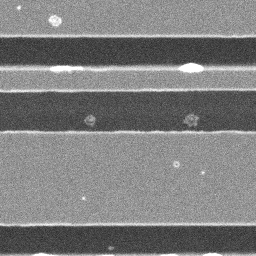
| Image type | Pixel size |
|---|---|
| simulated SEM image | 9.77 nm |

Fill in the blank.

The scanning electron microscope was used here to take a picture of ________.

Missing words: lines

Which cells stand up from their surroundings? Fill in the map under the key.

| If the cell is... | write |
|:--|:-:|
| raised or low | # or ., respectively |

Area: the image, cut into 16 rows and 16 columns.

################
################
................
................
################
################
................
................
################
################
################
################
################
################
................
................